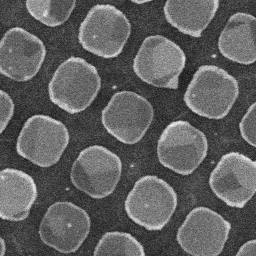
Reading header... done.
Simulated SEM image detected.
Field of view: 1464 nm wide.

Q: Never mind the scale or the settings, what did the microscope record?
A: a regular array of raised bodies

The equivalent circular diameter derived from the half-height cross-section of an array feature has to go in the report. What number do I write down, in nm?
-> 287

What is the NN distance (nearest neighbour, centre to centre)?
0.355 µm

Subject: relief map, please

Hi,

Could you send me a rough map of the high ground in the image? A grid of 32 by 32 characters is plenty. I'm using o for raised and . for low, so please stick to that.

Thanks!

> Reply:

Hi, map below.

...oooooo............oooooo.....
....ooooo..oooo......oooooo.....
.....ooo...ooooo.....ooooo...ooo
..........oooooo......oooo..oooo
.ooo......oooooo........o...oooo
ooooo.....ooooo...oooo.....ooooo
ooooo......oooo..oooooo.....oooo
ooooo...oo.......oooooo......ooo
ooooo..ooooo.....oooooo..oo.....
.ooo...ooooo.....ooooo..ooooo...
......oooooo.......ooo..oooooo..
......oooooo...o.......ooooooo..
o.....oooooo..oooo.....oooooo...
oo......ooo..oooooo.....ooooo..o
o...o........oooooo......ooo...o
o..ooooo.....oooooo...oo......oo
...ooooo......oooo...oooo.....oo
..oooooo.......oo...oooooo.....o
..oooooo...oo.......oooooo......
...ooooo..oooo......ooooo...ooo.
....ooo..oooooo.....ooooo..ooooo
ooo......oooooo.......oo...ooooo
oooo.....oooooo..ooo......oooooo
oooo......oooo...oooo.....oooooo
ooooo.......o...oooooo.....oooo.
oooo...oo.......oooooo......ooo.
oooo..ooooo.....oooooo..ooo.....
.oo..oooooo......oooo..ooooo....
.....oooooo.......oo..ooooooo...
.....oooooo..ooo......oooooo....
o.....oooo..ooooo.....oooooo...o
o.......o...oooooo.....ooooo..oo